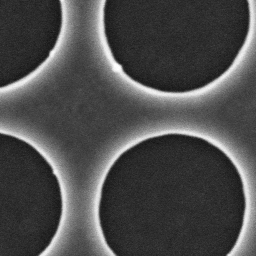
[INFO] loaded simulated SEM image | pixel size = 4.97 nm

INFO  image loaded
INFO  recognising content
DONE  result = holes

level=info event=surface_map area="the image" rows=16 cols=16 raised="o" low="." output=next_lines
....oo..........
....oo..........
....ooo........o
...oooo........o
..oooooo......oo
ooooooooo....ooo
oooooooooooooooo
oooooooooooooooo
.ooooooooo..oooo
..oooooo......oo
...oooo........o
....oo.........o
....oo.........o
....oo.........o
....oo.........o
...oooo........o